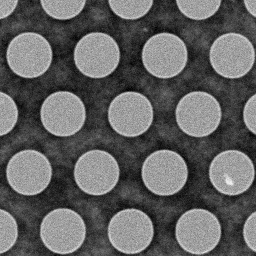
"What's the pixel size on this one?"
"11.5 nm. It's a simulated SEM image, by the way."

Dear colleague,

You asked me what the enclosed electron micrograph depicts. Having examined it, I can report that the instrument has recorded an array of small figures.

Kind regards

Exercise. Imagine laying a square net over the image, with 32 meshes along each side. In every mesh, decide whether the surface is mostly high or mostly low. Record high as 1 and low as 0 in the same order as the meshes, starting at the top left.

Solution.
11000111111000111110001111100001
10000011110000111100000111100001
00000000000000000000000000000000
00000000000000000000000000000000
00111000000111000001110000001100
01111100001111000011111000011110
01111100011111100011111000111111
01111100011111100011111000111111
01111100001111000011111000011110
00011000000110000001110000001100
00000000000000000000000000000000
00000000000000000000000000000000
11000011110000111100000111100001
11000111111000111110001111100001
11000111111000111110001111110001
11000111110000111110001111100001
10000011100000011100000111000000
00000000000000000000000000000000
00000000000000000000000000000000
00111000001111000001110000011110
01111100001111100011111000111110
01111100011111100011111000111111
01111100011111100011111000111111
00111100001111000001111000011110
00000000000000000000000000000000
00000000000000000000000000000000
10000011100000011100000111000000
11000111110000111110001111100001
11000111111000111110001111110001
11000111111000111110001111110001
11000011110000111110000111100001
00000001100000011000000011000000